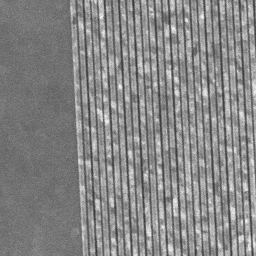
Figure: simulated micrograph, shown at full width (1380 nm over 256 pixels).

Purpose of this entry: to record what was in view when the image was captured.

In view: parallel lines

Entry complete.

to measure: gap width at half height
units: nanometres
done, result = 15.5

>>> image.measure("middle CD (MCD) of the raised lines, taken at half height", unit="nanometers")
25.6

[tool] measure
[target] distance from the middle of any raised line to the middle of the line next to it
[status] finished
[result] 38.2 nm